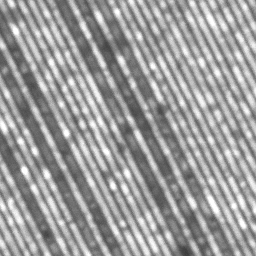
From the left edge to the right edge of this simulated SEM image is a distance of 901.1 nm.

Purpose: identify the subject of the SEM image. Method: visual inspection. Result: parallel lines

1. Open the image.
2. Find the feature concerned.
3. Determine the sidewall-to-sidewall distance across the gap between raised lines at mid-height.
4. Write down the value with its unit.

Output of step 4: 15 nanometers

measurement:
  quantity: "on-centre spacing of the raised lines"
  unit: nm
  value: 31.6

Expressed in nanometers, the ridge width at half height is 17.7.